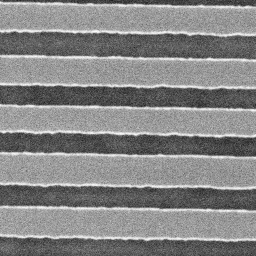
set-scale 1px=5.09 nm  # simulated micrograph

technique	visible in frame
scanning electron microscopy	lines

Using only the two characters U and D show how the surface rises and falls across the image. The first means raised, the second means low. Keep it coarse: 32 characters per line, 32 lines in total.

UUUUUUUUDDDDDDDDDDDDDDDDDDDDDDDD
UUUUUUUUUUUUUUUUUUUUUUUUUUUUUUUU
UUUUUUUUUUUUUUUUUUUUUUUUUUUUUUUU
UUUUUUUUUUUUUUUUUUUUUUUUUUUUUUUU
DDDDDDDDDDDDDDDDDDDDDDDDDDDUUDDD
DDDDDDDDDDDDDDDDDDDDDDDDDDDDDDDD
DDDDDDDDDDDDDDDDDDDDDDDDDDDDDDDD
UUUUUUUUUUUUUUUUUUUUUUUUUUUUUUUD
UUUUUUUUUUUUUUUUUUUUUUUUUUUUUUUU
UUUUUUUUUUUUUUUUUUUUUUUUUUUUUUUU
UUUUUUUUUUUUUUUUUUUUUUUUUUUUUUUU
DDDDDDDDDDDDDDDDDDDDDDDDDDDDDDDD
DDDDDDDDDDDDDDDDDDDDDDDDDDDDDDDD
UUUUUUUUUUUUUUUUUDUDDDDDDDDDDDDD
UUUUUUUUUUUUUUUUUUUUUUUUUUUUUUUU
UUUUUUUUUUUUUUUUUUUUUUUUUUUUUUUU
UUDUUUUUUUUUUUUUUUUUUUUUUUUUUUUU
DDDDDDDDDDDDDDDDDDDDDDDDDDDDDDDD
DDDDDDDDDDDDDDDDDDDDDDDDDDDDDDDD
UUUUUUUUUUUUUUUUUUUUUUUUUUDDDDDD
UUUUUUUUUUUUUUUUUUUUUUUUUUUUUUUU
UUUUUUUUUUUUUUUUUUUUUUUUUUUUUUUU
UUUUUUUUUUUUUUUUUUUUUUUUUUUUUUUU
DDDDDDDDDDDDDDDDDDDDDDDDDDDUUUUU
DDDDDDDDDDDDDDDDDDDDDDDDDDDDDDDD
DDDDDDDDDDDDDDDDDDDDDDDDDDDDDDDD
UUUUUUUUUUUUUUUUUUUUUUUUUUUUUUUU
UUUUUUUUUUUUUUUUUUUUUUUUUUUUUUUU
UUUUUUUUUUUUUUUUUUUUUUUUUUUUUUUU
UUUUUUUUUUUUUUUUUUUUUUUUUUUUUUUU
DDDDDDDDDDDDDDDDDDDDDDDDDDDDDDDD
DDDDDDDDDDDDDDDDDDDDDDDDDDDDDDDD